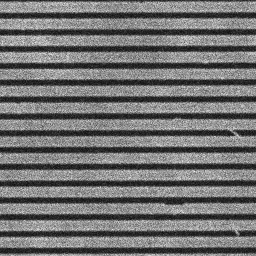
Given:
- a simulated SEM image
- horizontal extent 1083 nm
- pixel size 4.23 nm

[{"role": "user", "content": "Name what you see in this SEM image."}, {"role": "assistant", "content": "parallel lines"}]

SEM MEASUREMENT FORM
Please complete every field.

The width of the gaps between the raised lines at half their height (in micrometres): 0.0254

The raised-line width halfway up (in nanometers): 43.4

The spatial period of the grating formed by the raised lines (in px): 16.9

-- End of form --